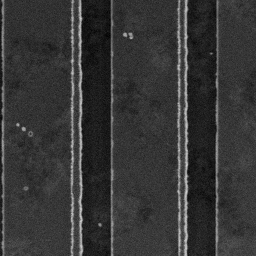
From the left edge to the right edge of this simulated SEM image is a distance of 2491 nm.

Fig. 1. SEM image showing lines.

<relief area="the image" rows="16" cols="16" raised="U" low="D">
UUUUUDDUUUUUDDUU
UUUUUDDUUUUUDDUU
UUUUUDDUUUUUDDUU
UUUUUDDUUUUUDDUU
UUUUUDDUUUUUDDUU
UUUUUDDUUUUUDDUU
UUUUUDDUUUUUDDUU
UUUUUDDUUUUUDDUU
UUUUUDDUUUUUDDUU
UUUUUDDUUUUUDDUU
UUUUUDDUUUUUDDUU
UUUUUDDUUUUUDDUU
UUUUUDDUUUUUDDUU
UUUUUDDUUUUUDDUU
UUUUUDDUUUUUDDUU
UUUUUDDUUUUUDDUU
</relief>